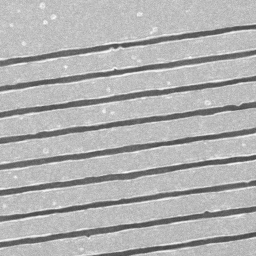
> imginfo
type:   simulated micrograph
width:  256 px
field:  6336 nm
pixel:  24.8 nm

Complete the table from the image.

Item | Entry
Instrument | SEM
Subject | parallel lines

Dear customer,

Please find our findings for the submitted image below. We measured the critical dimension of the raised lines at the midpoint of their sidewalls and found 490 nm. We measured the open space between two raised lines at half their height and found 0.156 um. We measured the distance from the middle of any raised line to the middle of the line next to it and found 638 nm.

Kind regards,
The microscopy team